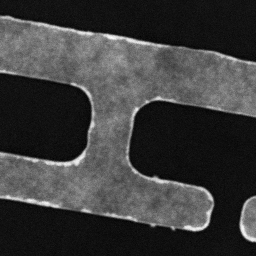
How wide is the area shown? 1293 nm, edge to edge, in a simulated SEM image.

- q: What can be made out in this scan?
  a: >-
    one or a few lines or trenches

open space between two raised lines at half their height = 398 nm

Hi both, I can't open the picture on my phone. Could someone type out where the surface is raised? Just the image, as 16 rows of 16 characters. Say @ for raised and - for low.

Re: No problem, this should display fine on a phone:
----------------
@@@-------------
@@@@@@@@@-------
@@@@@@@@@@@@@@--
@@@@@@@@@@@@@@@@
-----@@@@@@@@@@@
------@@@---@@@@
------@@--------
------@@--------
-----@@@--------
@@@@@@@@--------
@@@@@@@@@@@@----
-@@@@@@@@@@@@---
-------@@@@@@--@
---------------@
----------------